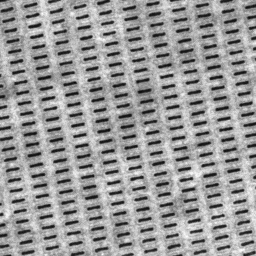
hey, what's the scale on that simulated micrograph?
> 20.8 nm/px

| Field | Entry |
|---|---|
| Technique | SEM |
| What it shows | a regular array of holes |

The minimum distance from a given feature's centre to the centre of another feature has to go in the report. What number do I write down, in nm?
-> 218